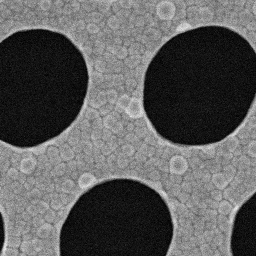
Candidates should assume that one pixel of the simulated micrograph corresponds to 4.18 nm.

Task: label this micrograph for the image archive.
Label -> holes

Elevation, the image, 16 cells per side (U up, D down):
UUUUUUUUUUUUUUUU
UUUUUUUUUUUUUUUU
DDDDUUUUUUUDDDDU
DDDDDUUUUUDDDDDD
DDDDDUUUUDDDDDDD
DDDDDUUUUDDDDDDD
DDDDDUUUUDDDDDDD
DDDDDUUUUDDDDDDU
DDDDUUUUUUDDDDUU
UUUUUUUUUUUUUUUU
UUUUUUUUUUUUUUUU
UUUUUUDDDUUUUUUU
UUUUUDDDDDUUUUUD
UUUUDDDDDDDUUUUD
UUUUDDDDDDDUUUDD
UUUUDDDDDDDUUUDD